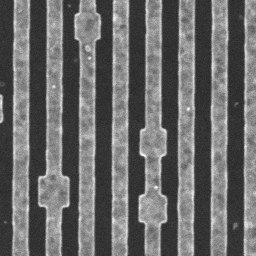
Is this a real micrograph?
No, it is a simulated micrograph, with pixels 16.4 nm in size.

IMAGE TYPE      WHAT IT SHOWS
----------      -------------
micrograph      wiring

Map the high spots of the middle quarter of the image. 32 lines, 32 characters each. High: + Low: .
....++++....++++.....+++.....+++
....++++....++++.....+++.....+++
....++++....++++.....+++.....+++
....++++....++++.....+++.....+++
....+++.....++++.....+++.....+++
....++++....++++.....+++.....+++
....++++....++++.....+++.....+++
....++++....++++.....+++.....+++
....++++....++++.....+++.....+++
....+++.....++++.....+++.....+++
....+++.....++++.....+++.....+++
....+++.....++++.....+++.....+++
....+++.....++++.....+++.....+++
....+++.....++++.....+++.....+++
....+++.....++++.....+++.....+++
....++++....++++.....+++.....+++
....++++....++++....+++++....+++
....++++....++++...++++++....+++
....++++....++++...++++++....+++
....++++....++++...++++++....+++
....++++....++++...++++++....+++
....++++....++++...++++++....+++
....+++.....++++...++++++....+++
....+++.....++++....++++.....+++
....+++.....++++.....+++.....+++
....+++.....++++.....+++.....+++
....+++.....++++.....+++.....+++
....+++.....++++.....+++.....+++
+...+++.....++++.....+++.....+++
+...+++.....++++.....+++.....+++
+...+++.....++++.....+++.....+++
+...+++.....++++.....+++.....+++